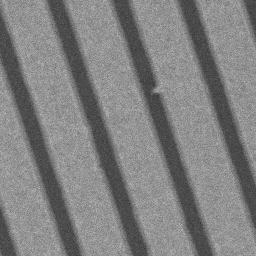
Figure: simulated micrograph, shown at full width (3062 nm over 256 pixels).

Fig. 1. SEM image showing one or a few lines or trenches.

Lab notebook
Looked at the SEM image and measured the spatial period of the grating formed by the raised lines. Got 0.743 micrometres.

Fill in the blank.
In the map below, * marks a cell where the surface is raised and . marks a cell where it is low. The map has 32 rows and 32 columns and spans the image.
******...*****...*****...*****..
.*****...*****...*****...*****..
.*****...*****...******..******.
.******...*****...*****...*****.
..*****...*****...*****...*****.
..*****...******..******..******
..******...*****...*****...*****
...*****...*****...*****...*****
...*****...*****...******...****
...******..******...*****...****
*...*****...*****...*****...****
*...*****...*****...******...***
*...******...*****...*****...***
**...*****...*****...*****...***
**...*****...*****...******...**
**...******..******...*****...**
***...*****...*****...*****...**
***...*****...*****...******..**
***...******...*****...*****...*
****...*****...*****...*****...*
****...*****...*****...******...
****...******...*****...*****...
*****...*****...*****...*****...
*****...*****...*****...******..
*****...******...*****...*****..
******...*****...*****...*****..
.*****...*****...*****...******.
.*****...******..******...*****.
.******...*****...*****...*****.
..*****...*****...*****...******
..*****...******...*****...*****
..******...*****...*****...*****